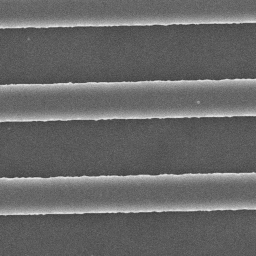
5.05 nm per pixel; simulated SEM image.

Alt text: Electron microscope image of lines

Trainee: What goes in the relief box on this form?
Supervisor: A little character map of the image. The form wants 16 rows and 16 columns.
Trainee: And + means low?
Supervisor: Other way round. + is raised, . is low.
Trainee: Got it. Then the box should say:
++++++++++++++++
+++++++++++++...
................
................
................
++++++++++++++++
++++++++++++++++
+++++...........
................
................
................
++++++++++++++++
++++++++++++++++
................
................
................